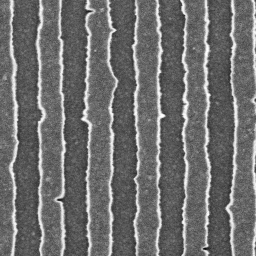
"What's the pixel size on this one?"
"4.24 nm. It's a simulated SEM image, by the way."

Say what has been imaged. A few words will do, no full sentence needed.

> parallel lines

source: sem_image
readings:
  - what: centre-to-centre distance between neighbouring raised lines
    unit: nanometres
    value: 204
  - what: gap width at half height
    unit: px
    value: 25.2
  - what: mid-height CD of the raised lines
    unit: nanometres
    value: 95.9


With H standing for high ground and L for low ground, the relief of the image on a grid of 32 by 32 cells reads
HLLLLHHHLLLHHHLLLHHHLLLHHHLLLHHH
HHLLLHHHLLLHHHLLLHHHLLLHHHLLLHHH
HLLLLHHLLLLHHHLLLHHHLLLHHHLLLHHH
HLLLLHHLLLLHHHLLLHHHLLLHHHLLLHHH
HLLLLHHHLLLHHHLLLHHHLLLHHHLLLHHH
HHLLLHHHLLLHHHLLLHHHLLLHHHLLLHHH
HHLLLHHHLLLHHHLLLHHHLLLHHHLLLHHH
HHLLLHHHLLLHHHLLLHHHLLLHHHLLLHHH
HHLLLHHHLLLHHHLLLHHHLLLHHHLLLHHH
HHLLLHHHLLLHHHLLLHHHLLLHHHLLLHHH
HHLLLHHHLLLHHHHLLHHHLLLHHHLLLHHH
HHLLLHHHLLLHHHLLLHHHLLLHHHLLLHHH
HHLLLHHHLLLHHHLLLHHHLLLHHHLLLHHH
HHLLLHHHLLLHHHLLLHHHLLLHHHLLLHHH
HHLLLHHHLLLHHHLLLHHHLLLHHHLLLHHH
HHLLLHHHLLLHHHLLLHHHLLLHHHLLLLHH
HHLLLHHHLLLHHHLLLHHHLLLHHHLLLHHH
HHLLLHHHLLLHHHLLLHHHLLLHHHLLLHHH
HHLLLHHHLLLHHHLLLHHHLLLHHHLLLHHH
HHLLLHHHLLLHHHLLLHHHLLLHHHLLLHHH
HHLLLHHHLLLHHHLLLHHHLLLHHHLLLHHH
HLLLLHHHLLLHHHLLLHHHLLLHHHLLLHHH
HHLLLHHHLLLHHHLLLHHHLLLHHHLLLHHH
HHLLLHHHLLLHHHLLLHHHLLLHHHLLLHHH
HHLLLHHHLLLHHHLLLHHHLLLHHHLLLHHH
HHLLLHHHLLLHHHLLLHHHLLLHHHLLLHHH
HHLLLHHHLLLHHHLLLHHHLLLHHHLLLHHH
HHLLLHHHLLLHHHLLLHHHLLLHHHLLLHHH
HHLLLHHHLLLHHHLLLHHHLLLHHHLLLHHH
HHLLLHHHLLLHHHLLLHHHLLLHHHLLLHHH
HHLLLHHHLLLHHHLLLHHHLLLHHHLLLHHH
HHLLLHHHLLLHHHLLLHHHLLLHHHLLLHHH